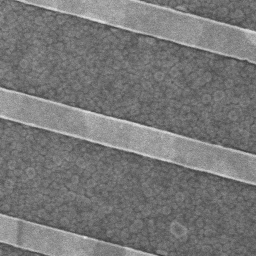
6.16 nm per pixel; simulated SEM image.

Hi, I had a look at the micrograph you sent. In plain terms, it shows one or a few lines or trenches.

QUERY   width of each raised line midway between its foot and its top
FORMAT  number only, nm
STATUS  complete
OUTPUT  171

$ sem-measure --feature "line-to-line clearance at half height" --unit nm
552